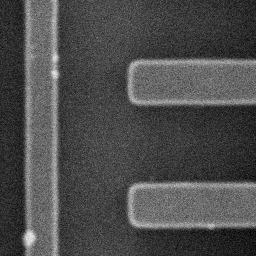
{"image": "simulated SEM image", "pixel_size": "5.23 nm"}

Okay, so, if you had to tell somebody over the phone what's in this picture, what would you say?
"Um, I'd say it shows groups of lines, slits or small figures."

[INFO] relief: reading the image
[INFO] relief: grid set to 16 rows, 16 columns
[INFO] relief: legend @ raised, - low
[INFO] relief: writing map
--@@------------
--@@------------
--@-------------
--@@------------
--@@----@@@@@@@@
--@@----@@@@@@@@
--@-------------
--@@------------
--@@------------
--@@------------
--@@------------
--@@------------
--@@----@@@@@@@@
--@@----@@@@@@@@
--@@------------
--@@------------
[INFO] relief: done